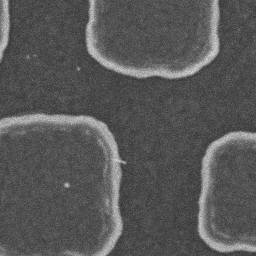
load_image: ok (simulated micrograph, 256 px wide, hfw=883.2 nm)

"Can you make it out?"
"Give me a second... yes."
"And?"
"raised bodies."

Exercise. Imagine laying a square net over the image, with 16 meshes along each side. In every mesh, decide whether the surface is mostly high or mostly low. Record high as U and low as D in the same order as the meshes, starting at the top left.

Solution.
DDDDDDUUUUUUUDDD
DDDDDDUUUUUUUDDD
DDDDDDUUUUUUUDDD
DDDDDDUUUUUUUDDD
DDDDDDDDUUUUDDDD
DDDDDDDDDDDDDDDD
DDDDDDDDDDDDDDDD
DUUUDDDDDDDDDDDD
UUUUUUUDDDDDDDDD
UUUUUUUDDDDDDUUU
UUUUUUUDDDDDDUUU
UUUUUUUDDDDDDUUU
UUUUUUUDDDDDDUUU
UUUUUUUDDDDDDUUU
UUUUUUUDDDDDDUUU
UUUUUUUDDDDDDDUD